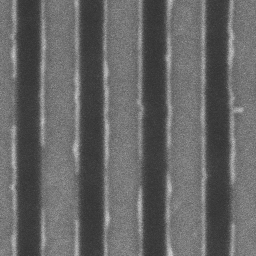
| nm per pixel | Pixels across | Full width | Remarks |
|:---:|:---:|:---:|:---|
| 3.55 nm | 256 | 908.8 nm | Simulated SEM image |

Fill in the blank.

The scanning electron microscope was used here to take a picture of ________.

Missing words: one or a few lines or trenches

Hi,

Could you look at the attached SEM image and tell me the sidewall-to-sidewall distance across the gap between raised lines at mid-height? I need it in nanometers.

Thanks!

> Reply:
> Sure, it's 111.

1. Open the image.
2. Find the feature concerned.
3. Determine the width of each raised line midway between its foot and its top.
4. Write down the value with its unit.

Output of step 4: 0.112 µm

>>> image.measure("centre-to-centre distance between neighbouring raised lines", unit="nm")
225